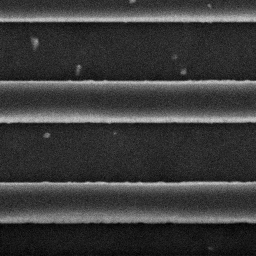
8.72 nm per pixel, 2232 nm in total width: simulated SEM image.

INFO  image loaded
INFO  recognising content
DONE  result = lines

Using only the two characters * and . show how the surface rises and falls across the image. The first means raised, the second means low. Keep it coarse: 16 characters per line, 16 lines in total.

****************
................
................
................
................
****************
****************
****************
................
................
................
****************
****************
****************
................
................